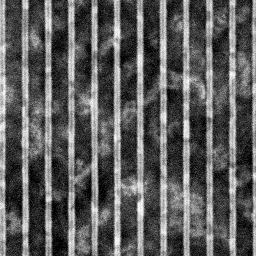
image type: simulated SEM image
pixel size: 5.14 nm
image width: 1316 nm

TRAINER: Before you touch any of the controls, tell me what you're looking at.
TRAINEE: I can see parallel lines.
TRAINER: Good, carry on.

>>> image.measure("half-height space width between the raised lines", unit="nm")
97.1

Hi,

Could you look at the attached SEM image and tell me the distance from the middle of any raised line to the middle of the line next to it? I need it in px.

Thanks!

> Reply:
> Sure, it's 23.1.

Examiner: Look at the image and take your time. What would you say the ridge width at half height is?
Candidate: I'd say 21.9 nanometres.